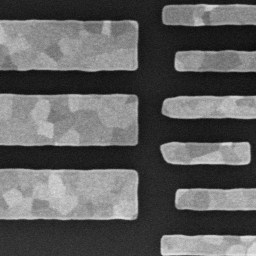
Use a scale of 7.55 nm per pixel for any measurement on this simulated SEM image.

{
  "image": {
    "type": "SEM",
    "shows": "wiring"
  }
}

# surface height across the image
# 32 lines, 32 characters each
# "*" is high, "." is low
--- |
................................
....................************
....................************
*****************...............
*****************...............
*****************...............
*****************.....**********
*****************.....**********
*****************.....**********
................................
................................
................................
*****************....***********
*****************...************
*****************....***********
*****************...............
*****************...............
*****************...............
....................***********.
....................***********.
.............................*..
*****************...............
*****************...............
*****************...............
*****************.....**********
*****************.....**********
*****************...............
................................
................................
.....................**.........
....................************
....................************